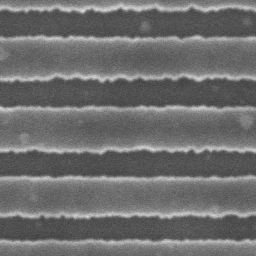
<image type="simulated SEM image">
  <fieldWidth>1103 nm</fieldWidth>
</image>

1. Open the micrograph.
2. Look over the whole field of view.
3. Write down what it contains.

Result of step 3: lines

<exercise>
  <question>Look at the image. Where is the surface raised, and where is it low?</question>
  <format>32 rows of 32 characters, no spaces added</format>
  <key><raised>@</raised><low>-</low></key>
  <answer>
@@@@@@@@@@@@@@@@@@@@@@@@@@@@@@@@
--------------------------------
--------------------------------
--------------------------------
--------------------------------
@@@@@@@@@@@@@@@@@@@@@@@@@@@@@@@@
@@@@@@@@@@@@@@@@@@@@@@@@@@@@@@@@
@@@@@@@@@@@@@@@@@@@@@@@@@@@@@@@@
@@@@@@@@@@@@@@@@@@@@@@@@@@@@@@@@
@@@@@@@@@@@@@@@@@@@@@@@@@@@@@@@@
--------------------------------
--------------------------------
--------------------------------
--@@@@@-@@@@@@@-@@@@@@@@@@@-@@@@
@@@@@@@@@@@@@@@@@@@@@@@@@@@@@@@@
@@@@@@@@@@@@@@@@@@@@@@@@@@@@@@@@
@@@@@@@@@@@@@@@@@@@@@@@@@@@@@@@@
@@@@@@@@@@@@@@@@@@@@@@@@@@@@@@@@
@@@@@@@@@@@@@@@@@@@@@@@@@@@@@@@@
--------------------------------
--------------------------------
--------------------------------
@@@@@@@@@@@@@@@@@@@@@@@@@@@@@@@@
@@@@@@@@@@@@@@@@@@@@@@@@@@@@@@@@
@@@@@@@@@@@@@@@@@@@@@@@@@@@@@@@@
@@@@@@@@@@@@@@@@@@@@@@@@@@@@@@@@
@@@@@@@@@@@@@@@@@@@@@@@@@@@@@@@@
--------------------------------
--------------------------------
--------------------------------
@@@@@@@@@@@@@@@@@@@@@@@@@@@@@@@@
@@@@@@@@@@@@@@@@@@@@@@@@@@@@@@@@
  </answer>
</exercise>